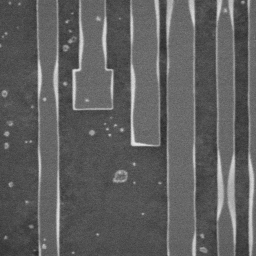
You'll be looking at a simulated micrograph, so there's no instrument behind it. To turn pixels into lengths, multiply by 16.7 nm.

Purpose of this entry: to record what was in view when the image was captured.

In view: groups of lines, slits or small figures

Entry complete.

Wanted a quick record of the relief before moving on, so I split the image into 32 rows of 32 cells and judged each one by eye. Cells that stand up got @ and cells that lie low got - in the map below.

-----@@---@@@---@@@@-@@@---@@--@
-----@@---@@@---@@@@-@@@---@@--@
-----@@---@@@----@@@-@@@---@@--@
-----@@---@@@----@@@-@@@---@@--@
-----@@---@@@----@@@-@@@---@@--@
-----@@---@@@---@@@@-@@@---@@--@
-----@@---@@@---@@@@-@@@---@@--@
-----@@---@@@---@@@@-@@@---@@--@
-----@@---@@@@---@@@-@@@---@@--@
-----@@--@@@@@---@@@-@@@---@@--@
-----@@--@@@@@---@@@-@@@---@@--@
-----@@--@@@@@---@@@-@@@---@@--@
-----@@--@@@@@---@@@-@@@---@@--@
-----@@--@@@@@---@@@-@@@---@@--@
-----@@----------@@@-@@@---@@--@
-----@@----------@@@-@@@---@@--@
-----@@----------@@@-@@@---@@--@
-----@@----------@@@-@@@---@@--@
-----@@--------------@@@---@@--@
-----@@--------------@@@---@@--@
-----@@--------------@@@---@@--@
-----@@--------------@@@---@@--@
-----@@--------------@@@----@--@
-----@@--------------@@@----@--@
-----@@--------------@@@----@--@
-----@@--------------@@@---@@--@
-----@@--------------@@@---@@--@
-----@@--------------@@@---@@--@
-----@@--------------@@@---@@--@
-----@@--------------@@@---@@--@
-----@@--------------@@@---@@--@
-----@@--------------@@@---@@--@